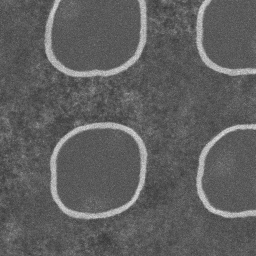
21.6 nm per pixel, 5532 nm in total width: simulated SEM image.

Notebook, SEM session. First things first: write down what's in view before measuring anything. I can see raised bodies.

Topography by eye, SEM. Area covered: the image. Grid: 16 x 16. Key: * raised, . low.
...******....***
...******...****
...******...****
...*****.....***
....***.........
................
................
................
....****......**
...******....***
...******....***
...******...****
....****.....***
................
................
................